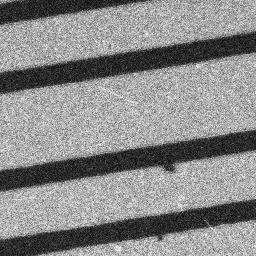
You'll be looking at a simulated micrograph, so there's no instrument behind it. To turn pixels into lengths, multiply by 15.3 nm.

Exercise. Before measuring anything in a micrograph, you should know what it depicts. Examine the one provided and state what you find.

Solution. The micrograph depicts one or a few lines or trenches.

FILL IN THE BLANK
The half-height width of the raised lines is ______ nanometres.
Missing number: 338